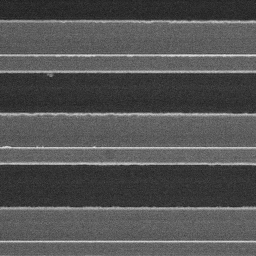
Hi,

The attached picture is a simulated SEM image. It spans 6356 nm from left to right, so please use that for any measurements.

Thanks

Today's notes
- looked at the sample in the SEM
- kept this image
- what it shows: lines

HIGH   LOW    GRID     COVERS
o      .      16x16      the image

................
oooooooooooooooo
oooooooooooooooo
oooooooooooooooo
................
................
................
oooooooooooooooo
oooooooooooooooo
oooooooooooooooo
................
................
................
oooooooooooooooo
oooooooooooooooo
oooooooooooooooo